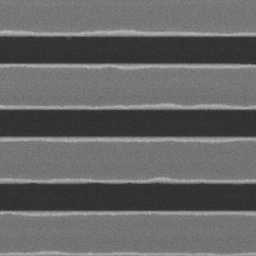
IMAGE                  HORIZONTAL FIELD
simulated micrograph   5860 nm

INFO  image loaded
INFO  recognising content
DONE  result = lines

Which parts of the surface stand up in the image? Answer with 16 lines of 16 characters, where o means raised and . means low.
oooooooooooooooo
oooooooooooooooo
................
................
oooooooooooooooo
oooooooooooooooo
oooooooooooooooo
................
................
oooooooooooooooo
oooooooooooooooo
................
................
oooooooooooooooo
oooooooooooooooo
oooooooooooooooo